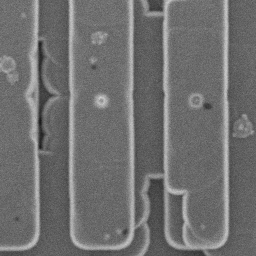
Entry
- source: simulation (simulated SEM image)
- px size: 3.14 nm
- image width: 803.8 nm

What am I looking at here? wiring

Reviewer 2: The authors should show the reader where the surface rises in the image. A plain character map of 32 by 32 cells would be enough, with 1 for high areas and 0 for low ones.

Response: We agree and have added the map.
11111000011111111000011111110000
11111000011111111000011111110000
11111000011111111000011111110000
11111000011111111000011111110000
11111000011111111000011111110000
11111000011111111000011111110000
11110000011111111000011111110000
11110000011111111000011111110000
11110000011111111000011111110000
11110000011111111000011111110000
11110000011111111000011111110000
11110000011111111000011111110000
11110000011111111000011101110000
11110000011111111000011111110000
11110000011111111000011111110000
11110000011111111000011111110000
11110000011111111000011111110000
11111000011111111000011111110000
11111000011111111000011111110000
11111000011111111000011111110000
11111000011111111000011111110000
11111000011111111000011111110000
11111000011111111000011111110000
11111000011111111000011111110000
11111000011111111000000111110000
11111000011111111000000111110000
11111000011111111000000111110000
11111000011111111000000111110000
11111000011111111000000111110000
11111000011111111000000111110000
11110000001111110000000111110000
00000000000000000000000000000000